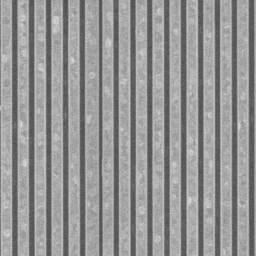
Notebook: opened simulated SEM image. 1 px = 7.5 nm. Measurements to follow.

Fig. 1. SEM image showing parallel lines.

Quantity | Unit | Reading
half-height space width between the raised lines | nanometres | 43.1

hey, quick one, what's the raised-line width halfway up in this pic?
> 79.7 nanometres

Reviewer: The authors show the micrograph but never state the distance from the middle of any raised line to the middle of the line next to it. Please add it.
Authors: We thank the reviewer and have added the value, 16.9 px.